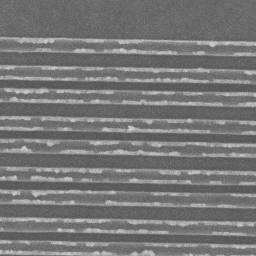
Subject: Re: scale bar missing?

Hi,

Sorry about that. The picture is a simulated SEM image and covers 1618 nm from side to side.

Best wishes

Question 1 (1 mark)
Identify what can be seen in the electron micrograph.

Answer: parallel lines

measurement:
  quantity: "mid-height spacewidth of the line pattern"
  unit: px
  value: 11.5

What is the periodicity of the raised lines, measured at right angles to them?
0.162 µm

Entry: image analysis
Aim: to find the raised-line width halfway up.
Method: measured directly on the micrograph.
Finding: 85.3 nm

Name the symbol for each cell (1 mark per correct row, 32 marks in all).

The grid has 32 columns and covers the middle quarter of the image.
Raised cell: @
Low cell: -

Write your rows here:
--------------------------------
@@@@@@@@@@@@@@@@@@@@@@@@@@@@@@@@
@@@@@@@@@@@@@@@@@@@@@@@@@@@@@@@@
@@@@@@@@@@@@@@@@@@@@@@@@@@@@@@@@
---------------------------@@@@@
--------------------------------
--------------------------------
@@@@@@@@@@@@@@@@@@@@@@@@@@@@@@@@
@@@@@@@@@@@@@@@@@@@@@@@@@@@@@@@@
@@@@@@@@@@@@@@@@@@@@@@@@@@@@@@@@
--------------------------------
--------------------------------
--------------------------------
@@@-@@@@------------------------
@@@@@@@@@@@@@@@@@@@@@@@@@@@@@@@@
@@@@@@@@@@@@@@@@@@@@@@@@@@@@@@@@
--@@@@@@@@@@@@@@@@@@@@@@@@@@@@@@
--------------------------------
--------------------------------
@@@@@@@@@@@@@@@@@@@@@@----------
@@@@@@@@@@@@@@@@@@@@@@@@@@@@@@@@
@@@@@@@@@@@@@@@@@@@@@@@@@@@@@@@@
---------------@@@@@@@@@@@@@@@@@
--------------------------------
--------------------------------
--------------------------------
@@@@@@@@@@@@@@@-----@@@@--------
@@@@@@@@@@@@@@@@@@@@@@@@@@@@@@@@
@@@@@@@@@@@@@@@@@@@@@@@@@@@@@@@@
-----@@-----------@@@@@@@@@@@@@@
--------------------------------
--------------------------------